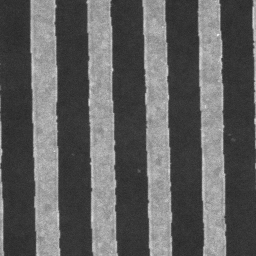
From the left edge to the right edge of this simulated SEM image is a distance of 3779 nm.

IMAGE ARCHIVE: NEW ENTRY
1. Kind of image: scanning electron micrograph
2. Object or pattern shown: lines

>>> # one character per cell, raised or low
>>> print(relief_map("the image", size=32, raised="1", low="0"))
00001110000111000011100001100000
00001110000111000011100001100000
00001110000111000011100001100000
00001110000111000011100001100000
00001110000111000011100001110000
00001110000111000011100001110000
00001110000111000011100001110000
00001110000111000011100001110000
00001110000111000011100001110000
00001110000111000011100001110000
00001110000111000011100001110000
00001110000111000011100001110000
00001110000111000011100001110000
00001110000111000011100001110000
00001110000111000001100001110000
00001110000111000001100001110000
00001110000111000001100001110000
00001110000111000001100001110000
00001110000111000001100001110000
00001110000111000001100001110000
00001110000111000001100001110000
00001110000011000001100001110000
00000110000011000001100001110000
00000110000011000001100001110000
00000110000011000001100001110000
00000110000011000001100001110000
00000110000011000001100000110000
00000110000011000001100000110000
00000110000011000001100000110000
00000110000011000001100000110000
00000110000011000001100000110000
00000110000011100001100000110000